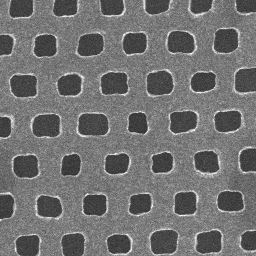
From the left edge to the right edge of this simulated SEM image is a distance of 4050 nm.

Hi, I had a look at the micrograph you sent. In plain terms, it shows a regular array of holes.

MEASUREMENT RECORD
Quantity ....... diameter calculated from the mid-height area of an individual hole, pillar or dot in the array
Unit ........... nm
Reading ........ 393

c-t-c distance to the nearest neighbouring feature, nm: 711